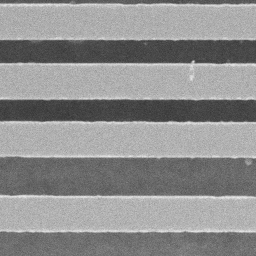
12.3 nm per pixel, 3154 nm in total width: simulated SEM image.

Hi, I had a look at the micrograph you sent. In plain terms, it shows lines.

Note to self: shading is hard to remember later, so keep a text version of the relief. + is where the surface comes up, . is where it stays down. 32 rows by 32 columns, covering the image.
................................
++++++++++++++++++++++++++++++++
++++++++++++++++++++++++++++++++
++++++++++++++++++++++++++++++++
++++++++++++++++++++++++++++++++
................................
................................
................................
++++++++++++++++++++++++++++++++
++++++++++++++++++++++++++++++++
++++++++++++++++++++++++++++++++
++++++++++++++++++++++++++++++++
................................
................................
................................
++++++++++++++++++++++++++++++++
++++++++++++++++++++++++++++++++
++++++++++++++++++++++++++++++++
++++++++++++++++++++++++++++++++
+.++++++++++++++++++++++++++++++
................................
................................
................................
................................
+.+++++.....+...................
++++++++++++++++++++++++++++++++
++++++++++++++++++++++++++++++++
++++++++++++++++++++++++++++++++
++++++++++++++++++++++++++++++++
................................
................................
................................